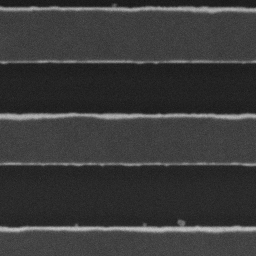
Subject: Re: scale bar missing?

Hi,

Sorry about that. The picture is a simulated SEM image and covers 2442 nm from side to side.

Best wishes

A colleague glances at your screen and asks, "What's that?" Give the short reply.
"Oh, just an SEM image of lines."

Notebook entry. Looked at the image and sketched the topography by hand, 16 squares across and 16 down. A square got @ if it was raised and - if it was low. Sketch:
@@@@@@@@@@@@@@@-
@@@@@@@@@@@@@@@@
@@@@@@@@@@@@@@@@
@@@@@@@@@@@@@@@@
----------------
----------------
----------------
@@@@@@@@@@@@@@@@
@@@@@@@@@@@@@@@@
@@@@@@@@@@@@@@@@
----------------
----------------
----------------
----------------
@@@@@@@@@@@@@@@@
@@@@@@@@@@@@@@@@